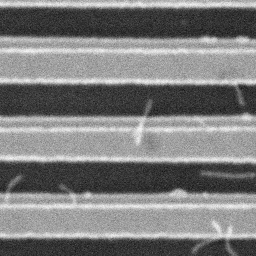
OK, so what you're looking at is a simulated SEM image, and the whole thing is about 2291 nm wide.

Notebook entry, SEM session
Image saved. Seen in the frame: lines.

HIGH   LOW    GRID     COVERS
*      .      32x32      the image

********************************
................................
................................
................................
................................
********************************
********************************
********************************
********************************
********************************
.............................*..
................................
................................
................................
..............................*.
********************************
********************************
********************************
********************************
********************************
................................
................................
................................
................................
********************************
********************************
********************************
********************************
********************************
********************.***********
................................
................................